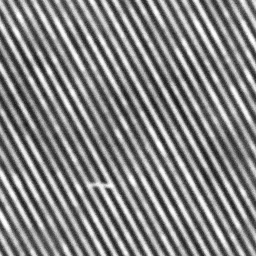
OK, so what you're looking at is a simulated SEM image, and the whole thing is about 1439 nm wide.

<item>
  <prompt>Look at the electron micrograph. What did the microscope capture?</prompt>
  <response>parallel lines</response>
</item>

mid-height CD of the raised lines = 14.2 nm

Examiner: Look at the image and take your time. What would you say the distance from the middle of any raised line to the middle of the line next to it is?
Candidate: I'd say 0.0571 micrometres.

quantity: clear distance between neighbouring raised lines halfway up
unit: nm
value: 42.6